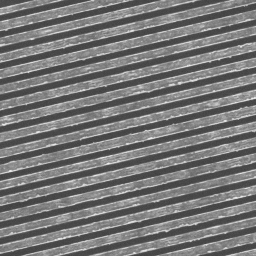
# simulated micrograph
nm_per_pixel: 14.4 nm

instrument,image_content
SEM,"parallel lines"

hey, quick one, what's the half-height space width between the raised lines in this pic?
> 94.4 nanometers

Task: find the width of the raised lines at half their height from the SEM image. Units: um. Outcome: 0.121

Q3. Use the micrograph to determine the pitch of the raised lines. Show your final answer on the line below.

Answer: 223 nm